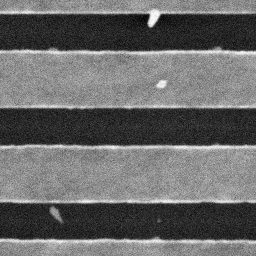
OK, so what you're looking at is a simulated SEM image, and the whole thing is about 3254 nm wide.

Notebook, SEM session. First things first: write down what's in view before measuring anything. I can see lines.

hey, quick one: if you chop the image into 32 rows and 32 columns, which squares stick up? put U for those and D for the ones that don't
UUUUUUUUUUUUUUUUUUUUUUUUUUUUUUUU
UUUUUUUUUUUUUUUUUUUUUUUUUUUUUUUU
DDDDDDDDDDDDDDDDDDDUDDDDDDDDDDDD
DDDDDDDDDDDDDDDDDDDDDDDDDDDDDDDD
DDDDDDDDDDDDDDDDDDDDDDDDDDDDDDDD
DDDDDDDDDDDDDDDDDDDDDDDDDDDDDDDD
UUUUUUUUUUUUUUUUDDDUUUUUUUUUUUDD
UUUUUUUUUUUUUUUUUUUUUUUUUUUUUUUU
UUUUUUUUUUUUUUUUUUUUUUUUUUUUUUUU
UUUUUUUUUUUUUUUUUUUUUUUUUUUUUUUU
UUUUUUUUUUUUUUUUUUUUUUUUUUUUUUUU
UUUUUUUUUUUUUUUUUUUUUUUUUUUUUUUU
UUUUUUUUUUUUUUUUUUUUUUUUUUUUUUUU
DDDDDDDDDDDDDDDDDDDDDDDDDDDDDDDD
DDDDDDDDDDDDDDDDDDDDDDDDDDDDDDDD
DDDDDDDDDDDDDDDDDDDDDDDDDDDDDDDD
DDDDDDDDDDDDDDDDDDDDDDDDDDDDDDDD
DDDDDDDDDDDDDDDDDDDDDDDDDDDDDDDD
UUUUUUUUUUUUUUUUUUUUUUUUUUUUUUUU
UUUUUUUUUUUUUUUUUUUUUUUUUUUUUUUU
UUUUUUUUUUUUUUUUUUUUUUUUUUUUUUUU
UUUUUUUUUUUUUUUUUUUUUUUUUUUUUUUU
UUUUUUUUUUUUUUUUUUUUUUUUUUUUUUUU
UUUUUUUUUUUUUUUUUUUUUUUUUUUUUUUU
UUUUUUUUUUUUUUUUUUUUUUUUUUUUUUUU
DDDDDDDDDDDDDDDDDDDDDDDDDDDDDDDD
DDDDDDDDDDDDDDDDDDDDDDDDDDDDDDDD
DDDDDDDDDDDDDDDDDDDDDDDDDDDDDDDD
DDDDDDDDDDDDDDDDDDDDDDDDDDDDDDDD
DDDDDDDDDDDDDDDDDDDDDDDDDDDDDDDD
UUUUUUUUUUUUUUUUUUUUUUUUUUUUUUUU
UUUUUUUUUUUUUUUUUUUUUUUUUUUUUUUU